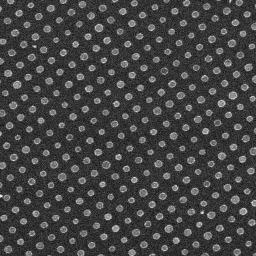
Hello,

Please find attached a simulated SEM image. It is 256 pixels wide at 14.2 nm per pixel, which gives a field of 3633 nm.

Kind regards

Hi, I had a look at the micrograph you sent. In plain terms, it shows a regular array of raised bodies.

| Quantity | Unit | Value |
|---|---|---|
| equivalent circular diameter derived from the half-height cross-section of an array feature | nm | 83.2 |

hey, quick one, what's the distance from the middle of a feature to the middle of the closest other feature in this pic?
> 198 nm